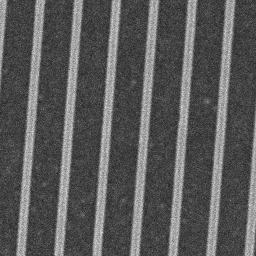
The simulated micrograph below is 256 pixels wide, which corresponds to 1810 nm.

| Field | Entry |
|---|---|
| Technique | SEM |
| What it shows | parallel lines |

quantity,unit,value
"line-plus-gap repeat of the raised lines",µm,0.268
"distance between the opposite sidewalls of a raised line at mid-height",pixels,7.98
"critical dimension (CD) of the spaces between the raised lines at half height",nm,212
